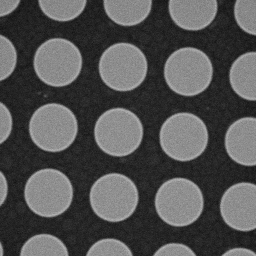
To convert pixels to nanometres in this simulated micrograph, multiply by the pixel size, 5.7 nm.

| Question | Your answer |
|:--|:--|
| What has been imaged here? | an array of small figures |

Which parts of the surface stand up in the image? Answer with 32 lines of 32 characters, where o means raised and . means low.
oo...oooooo..oooooo..oooooo..ooo
o....ooooo...oooooo..oooooo..ooo
.......oo.....oooo....ooooo...oo
.......................oo.....oo
................................
o....oooo......o................
oo...ooooo...ooooo....ooo.......
oo..oooooo...ooooo...ooooo....oo
oo..oooooo..oooooo...ooooo...ooo
o....ooooo...ooooo...ooooo...ooo
......oo.....oooo....ooooo...ooo
......................ooo....ooo
................................
o....ooo........................
o...ooooo....oooo.....oo........
o...oooooo..oooooo..ooooo....ooo
o...oooooo..oooooo..oooooo..oooo
o...ooooo...oooooo..oooooo..oooo
.....ooo.....oooo...oooooo..oooo
.....................oooo....ooo
..............................oo
.....ooo........................
o...ooooo...oooo.....oo.........
o..oooooo...ooooo...ooooo....ooo
o..oooooo..oooooo..oooooo...oooo
...oooooo..oooooo..oooooo...oooo
....oooo....ooooo...ooooo...oooo
.............oo.....oooo....oooo
.............................ooo
....oo..........................
...ooooo....ooo......o..........
...ooooo...ooooo....oooo....oooo